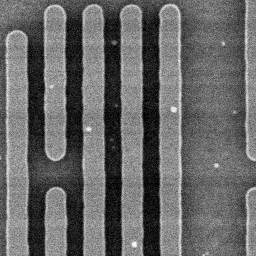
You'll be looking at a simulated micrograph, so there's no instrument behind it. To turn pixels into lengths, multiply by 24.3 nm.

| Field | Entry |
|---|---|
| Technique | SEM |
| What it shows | groups of lines, slits or small figures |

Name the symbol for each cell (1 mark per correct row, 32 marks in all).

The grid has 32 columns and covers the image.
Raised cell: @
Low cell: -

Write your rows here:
-------------------------------@
------@@---@@--@@@--@@---------@
------@@--@@@--@@@--@@---------@
------@@--@@@--@@@--@@---------@
-@@---@@--@@@--@@@--@@---------@
-@@---@@--@@@--@@@--@@---------@
-@@---@@--@@@--@@@--@@---------@
-@@---@@--@@@--@@@--@@---------@
-@@---@@--@@@--@@@--@@@--------@
-@@---@@--@@@--@@@--@@@--------@
-@@---@@--@@@--@@@--@@@--------@
-@@---@@--@@@--@@@--@@@--------@
-@@---@@--@@@--@@@--@@@--------@
-@@---@@--@@@--@@@--@@@--------@
-@@---@@--@@@--@@@--@@@--------@
-@@---@@--@@@--@@@--@@@--------@
-@@---@@--@@@--@@@--@@@--------@
-@@---@@---@@--@@@--@@@--------@
-@@---@@---@@--@@@--@@@--------@
-@@---@@--@@@--@@@--@@@--------@
-@@-------@@@--@@@--@@@---------
-@@-------@@@--@@@--@@@---------
-@@--------@@--@@@--@@@---------
-@@--------@@--@@@--@@@---------
-@@---@@---@@--@@@--@@@--------@
-@@---@@---@@--@@@--@@@--------@
-@@---@@---@@--@@@--@@@--------@
-@@---@@---@@--@@@--@@@--------@
-@@---@@---@@--@@@--@@@--------@
-@@---@@---@@--@@@--@@@--------@
-@@---@@---@@--@@@--@@@--------@
-@@---@@---@@--@@@--@@@--------@